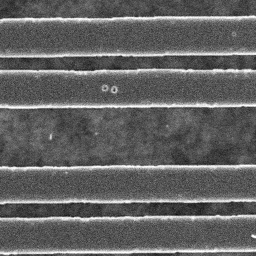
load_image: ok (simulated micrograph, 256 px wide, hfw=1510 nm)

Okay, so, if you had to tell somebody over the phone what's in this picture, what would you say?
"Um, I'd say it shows lines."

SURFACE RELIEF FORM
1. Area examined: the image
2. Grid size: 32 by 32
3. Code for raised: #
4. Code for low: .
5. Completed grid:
................................
................................
..##############################
################################
################################
################################
################################
................................
................................
################################
################################
################################
################################
................................
................................
................................
................................
................................
................................
................................
................................
################################
################################
################################
################################
................................
................................
################################
################################
################################
################################
#################...............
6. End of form